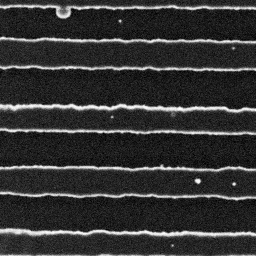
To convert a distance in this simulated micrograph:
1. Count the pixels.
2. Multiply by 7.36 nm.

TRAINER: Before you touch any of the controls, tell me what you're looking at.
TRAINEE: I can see lines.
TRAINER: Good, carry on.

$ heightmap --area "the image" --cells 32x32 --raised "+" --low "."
++++++++++++++++++++++++++++++++
.......++.......................
................................
................................
................................
++++++++++++++++++++++++++++++++
++++++++++++++++++++++++++++++++
++++++++++++++++++++++++++++++++
+....+++++++++++++++++++++++++++
................................
................................
................................
................................
++++++++++++++++++++....+.++....
++++++++++++++++++++++++++++++++
++++++++++++++++++++++++++++++++
............++++++++++++++++++++
................................
................................
................................
................................
++++++++++++++++++++++++++++++++
++++++++++++++++++++++++++++++++
++++++++++++++++++++++++++++++++
...++...++++++++.+++++++++++++++
................................
................................
................................
................................
++++++++++++++++++++++++++++++++
++++++++++++++++++++++++++++++++
++++++++++++++++++++++++++++++++